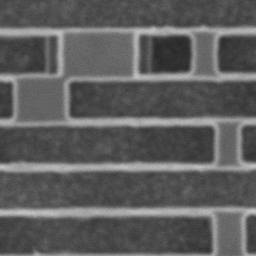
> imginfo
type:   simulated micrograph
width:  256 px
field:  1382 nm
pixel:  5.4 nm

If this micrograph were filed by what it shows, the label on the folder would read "parallel lines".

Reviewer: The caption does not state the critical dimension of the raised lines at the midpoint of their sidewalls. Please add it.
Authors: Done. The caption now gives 0.0337 micrometres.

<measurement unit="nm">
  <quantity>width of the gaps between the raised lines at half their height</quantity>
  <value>210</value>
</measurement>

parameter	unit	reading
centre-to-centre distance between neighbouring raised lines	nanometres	244